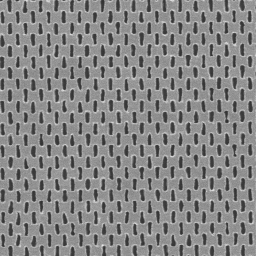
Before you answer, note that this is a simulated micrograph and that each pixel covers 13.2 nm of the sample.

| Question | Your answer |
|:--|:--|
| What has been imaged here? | a regular array of holes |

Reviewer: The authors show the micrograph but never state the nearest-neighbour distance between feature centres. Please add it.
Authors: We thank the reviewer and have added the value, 169 nanometers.